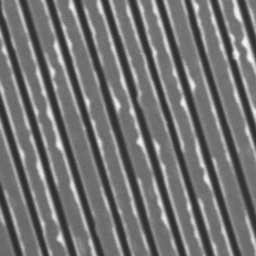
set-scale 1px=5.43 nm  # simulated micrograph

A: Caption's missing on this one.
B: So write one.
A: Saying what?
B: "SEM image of parallel lines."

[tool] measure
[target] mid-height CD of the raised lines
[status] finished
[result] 104 nm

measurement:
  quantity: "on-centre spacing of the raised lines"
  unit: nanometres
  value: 142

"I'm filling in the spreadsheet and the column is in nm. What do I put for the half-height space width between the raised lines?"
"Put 39.5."